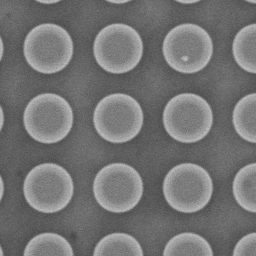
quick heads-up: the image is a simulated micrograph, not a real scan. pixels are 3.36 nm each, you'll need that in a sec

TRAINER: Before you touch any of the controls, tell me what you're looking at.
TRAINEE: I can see an array of small figures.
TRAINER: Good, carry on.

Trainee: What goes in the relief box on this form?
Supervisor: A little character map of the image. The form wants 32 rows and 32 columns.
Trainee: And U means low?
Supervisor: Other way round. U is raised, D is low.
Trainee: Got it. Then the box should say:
DDDDDDDDDDDDDDDDDDDDDDDDDDDDDDDD
DDDDDDDDDDDDDDDDDDDDDDDDDDDDDDDD
DDDDDDDDDDDDDDDDDDDDDDDDDDDDDDDD
DDDDUUUUDDDDDUUUDDDDDDUUUDDDDDUU
DDDUUUUUUDDDUUUUUDDDDUUUUUDDDDUU
DDDUUUUUUDDDUUUUUUDDUUUUUUDDDUUU
DDDUUUUUUDDDUUUUUUDDUUUUUUDDDUUU
DDDUUUUUUDDDUUUUUDDDDUUUUUDDDUUU
DDDDUUUUDDDDDUUUUDDDDDUUUDDDDDUU
DDDDDDDDDDDDDDDDDDDDDDDDDDDDDDDD
DDDDDDDDDDDDDDDDDDDDDDDDDDDDDDDD
DDDDDDDDDDDDDDDDDDDDDDDDDDDDDDDD
DDDDUUUUDDDDDUUUUDDDDUUUUUDDDDUU
DDDUUUUUUDDDUUUUUUDDDUUUUUDDDUUU
DDDUUUUUUDDDUUUUUUDDUUUUUUDDDUUU
DDDUUUUUUDDDUUUUUUDDUUUUUUDDDUUU
DDDUUUUUUDDDUUUUUDDDDUUUUUDDDDUU
DDDDDUUDDDDDDUUUDDDDDDUUUDDDDDDU
DDDDDDDDDDDDDDDDDDDDDDDDDDDDDDDD
DDDDDDDDDDDDDDDDDDDDDDDDDDDDDDDD
DDDDDUUDDDDDDDUDDDDDDDDUDDDDDDDU
DDDDUUUUDDDDUUUUUDDDDUUUUUDDDDUU
DDDUUUUUUDDDUUUUUUDDDUUUUUDDDUUU
DDDUUUUUUDDDUUUUUUDDUUUUUUUDDUUU
DDDUUUUUUDDDUUUUUUDDDUUUUUDDDUUU
DDDDUUUUDDDDUUUUUDDDDUUUUUDDDDUU
DDDDDUUDDDDDDDUDDDDDDDDUDDDDDDDD
DDDDDDDDDDDDDDDDDDDDDDDDDDDDDDDD
DDDDDDDDDDDDDDDDDDDDDDDDDDDDDDDD
DDDDDUUDDDDDDUUUDDDDDDUUUDDDDDDU
DDDDUUUUUDDDUUUUUDDDDUUUUUDDDDUU
DDDUUUUUUDDDUUUUUUDDUUUUUUUDDUUU